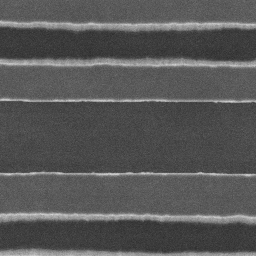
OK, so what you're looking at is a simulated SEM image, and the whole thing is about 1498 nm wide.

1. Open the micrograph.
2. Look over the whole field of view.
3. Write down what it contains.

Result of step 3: lines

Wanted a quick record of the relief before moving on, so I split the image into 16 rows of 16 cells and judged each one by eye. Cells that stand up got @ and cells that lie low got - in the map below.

@@@@@@@@@@@@@@@@
-@@@@@@@@@@@@@@@
----------------
----------------
@@@@@@@@@@@@@@@@
@@@@@@@@@@@@@@@@
----------------
----------------
----------------
----------------
----------------
@@@@@@@@@@@@@@@@
@@@@@@@@@@@@@@@@
-----@@@@@@@@@@@
----------------
----------------